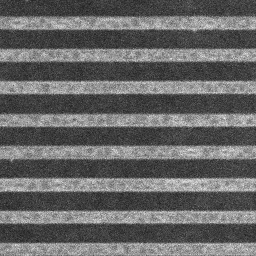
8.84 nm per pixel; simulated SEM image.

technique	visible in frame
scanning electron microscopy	parallel lines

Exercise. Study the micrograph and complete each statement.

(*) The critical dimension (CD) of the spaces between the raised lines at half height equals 0.183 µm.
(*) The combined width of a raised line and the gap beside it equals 286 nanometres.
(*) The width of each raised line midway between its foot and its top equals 99.5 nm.